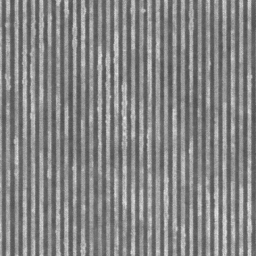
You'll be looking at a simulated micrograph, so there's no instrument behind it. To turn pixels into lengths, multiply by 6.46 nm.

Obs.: parallel lines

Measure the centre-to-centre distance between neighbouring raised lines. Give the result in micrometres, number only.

0.0537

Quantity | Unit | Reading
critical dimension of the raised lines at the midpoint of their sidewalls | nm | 19.4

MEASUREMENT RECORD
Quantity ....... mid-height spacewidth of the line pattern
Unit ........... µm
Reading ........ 0.0331